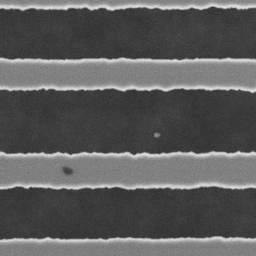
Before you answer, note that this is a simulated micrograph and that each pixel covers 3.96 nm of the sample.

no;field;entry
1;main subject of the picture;lines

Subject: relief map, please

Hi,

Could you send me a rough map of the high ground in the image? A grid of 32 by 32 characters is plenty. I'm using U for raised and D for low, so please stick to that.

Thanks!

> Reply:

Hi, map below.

UUUUUUUUUUUUUUUUUUUUUUUUUUUUUUUU
DDDDDDDDDDDDDDDDDDDDDDDDDDDDDDDD
DDDDDDDDDDDDDDDDDDDDDDDDDDDDDDDD
DDDDDDDDDDDDDDDDDDDDDDDDDDDDDDDD
DDDDDDDDDDDDDDDDDDDDDDDDDDDDDDDD
DDDDDDDDDDDDDDDDDDDDDDDDDDDDDDDD
DDDDDDDDDDDDDDDDDDDDDDDDDDDDDDDD
UUUUUUDDDDUUUUUUUUUDDUDUUUUUUUUU
UUUUUUUUUUUUUUUUUUUUUUUUUUUUUUUU
UUUUUUUUUUUUUUUUUUUUUUUUUUUUUUUU
UUUUUUUUUUUUUUUUUUUUUUUUUUUUUUUU
DDDDDDDDDDDDDDDDDDDDDDDDDDDDDDDD
DDDDDDDDDDDDDDDDDDDDDDDDDDDDDDDD
DDDDDDDDDDDDDDDDDDDDDDDDDDDDDDDD
DDDDDDDDDDDDDDDDDDDDDDDDDDDDDDDD
DDDDDDDDDDDDDDDDDDDDDDDDDDDDDDDD
DDDDDDDDDDDDDDDDDDDDDDDDDDDDDDDD
DDDDDDDDDDDDDDDDDDDDDDDDDDDDDDDD
DDDDDDDDDDDDDDDDDDDDDDDDDDDDDDDD
UUUUUUUUUUUUUUUUUUUUUUUUUUUUUUUU
UUUUUUUUUUUUUUUUUUUUUUUUUUUUUUUU
UUUUUUUUUUUUUUUUUUUUUUUUUUUUUUUU
UUUUUUUUUUUUUUUUUUUUUUUUUUUUUUUU
UDDDDDUUUUDUDDDUUDUDDUUUDDDDDUUD
DDDDDDDDDDDDDDDDDDDDDDDDDDDDDDDD
DDDDDDDDDDDDDDDDDDDDDDDDDDDDDDDD
DDDDDDDDDDDDDDDDDDDDDDDDDDDDDDDD
DDDDDDDDDDDDDDDDDDDDDDDDDDDDDDDD
DDDDDDDDDDDDDDDDDDDDDDDDDDDDDDDD
DDDDDDDDDDDDDDDDDDDDDDDDDDDDDDDD
UUUUUUUUUUUUUUUUUUUUUUUUUUUUUUUU
UUUUUUUUUUUUUUUUUUUUUUUUUUUUUUUU